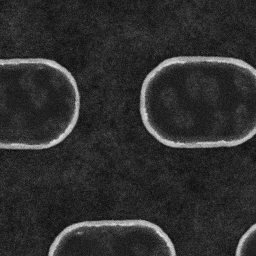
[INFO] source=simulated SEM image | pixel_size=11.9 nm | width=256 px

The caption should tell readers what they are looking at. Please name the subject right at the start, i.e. raised bodies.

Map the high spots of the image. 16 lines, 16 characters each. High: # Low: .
................
................
................
................
####......######
#####....#######
#####....#######
#####....#######
####......######
................
................
................
................
................
....######......
...########....#